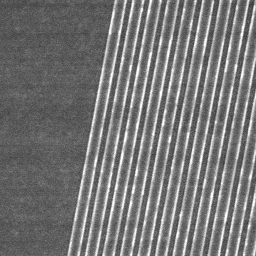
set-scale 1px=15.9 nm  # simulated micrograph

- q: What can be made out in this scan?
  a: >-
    parallel lines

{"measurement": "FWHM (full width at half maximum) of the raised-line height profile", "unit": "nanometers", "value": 172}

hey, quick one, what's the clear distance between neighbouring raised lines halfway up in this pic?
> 102 nanometers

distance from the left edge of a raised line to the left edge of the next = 274 nm